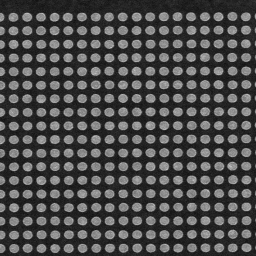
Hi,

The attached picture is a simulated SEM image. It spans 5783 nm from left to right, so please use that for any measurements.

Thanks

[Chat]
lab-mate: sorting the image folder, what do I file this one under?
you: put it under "a regular array of raised bodies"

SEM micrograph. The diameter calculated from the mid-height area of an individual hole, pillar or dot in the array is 0.194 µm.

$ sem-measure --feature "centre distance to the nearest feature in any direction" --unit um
0.303